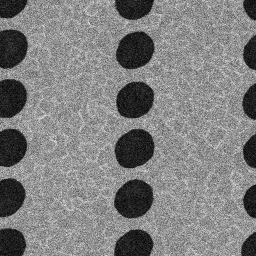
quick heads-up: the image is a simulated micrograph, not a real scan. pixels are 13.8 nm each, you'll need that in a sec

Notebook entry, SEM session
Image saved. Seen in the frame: holes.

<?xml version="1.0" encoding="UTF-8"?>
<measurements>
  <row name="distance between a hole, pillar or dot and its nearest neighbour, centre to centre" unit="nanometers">680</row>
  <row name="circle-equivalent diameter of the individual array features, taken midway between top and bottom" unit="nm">533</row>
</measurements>